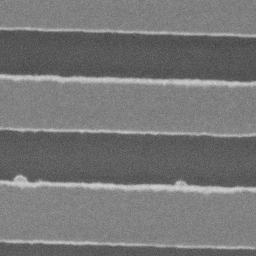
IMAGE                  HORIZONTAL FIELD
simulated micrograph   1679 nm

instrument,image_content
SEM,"lines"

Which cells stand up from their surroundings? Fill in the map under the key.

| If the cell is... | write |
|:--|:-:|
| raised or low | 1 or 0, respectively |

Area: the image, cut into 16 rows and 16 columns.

1111111111111111
1111111111111111
0000000000000000
0000000000000000
0000000000000000
1111111111111111
1111111111111111
1111111111111111
0000000000000000
0000000000000000
0000000000000000
1111100000000000
1111111111111111
1111111111111111
1111111111111111
0000000000000111